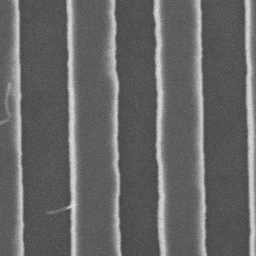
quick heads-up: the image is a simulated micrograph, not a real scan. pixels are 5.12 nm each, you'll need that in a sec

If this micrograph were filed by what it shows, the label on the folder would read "lines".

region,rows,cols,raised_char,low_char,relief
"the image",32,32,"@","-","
@@-------@@@@@------@@@@@------@
@@-------@@@@@------@@@@@------@
@@-------@@@@@------@@@@@------@
@@-------@@@@@------@@@@@------@
@@-------@@@@@------@@@@@------@
@@-------@@@@@------@@@@@------@
@@-------@@@@@------@@@@@------@
@@-------@@@@@------@@@@@------@
@@-------@@@@@------@@@@@------@
@@-------@@@@@@-----@@@@@------@
@@-------@@@@@@-----@@@@@------@
@@-------@@@@@@-----@@@@@------@
@@-------@@@@@@-----@@@@@------@
@@-------@@@@@@-----@@@@@------@
@@-------@@@@@@-----@@@@@------@
@@@------@@@@@@-----@@@@@------@
@@@------@@@@@@-----@@@@@------@
@@@------@@@@@@-----@@@@@------@
@@@------@@@@@@-----@@@@@------@
@@@------@@@@@@-----@@@@@------@
@@@------@@@@@@-----@@@@@------@
@@@------@@@@@@-----@@@@@------@
@@@------@@@@@@-----@@@@@------@
@@@------@@@@@@-----@@@@@@-----@
@@@------@@@@@@-----@@@@@@-----@
@@@------@@@@@@-----@@@@@@-----@
@@@------@@@@@@-----@@@@@@------
@@@------@@@@@@-----@@@@@@------
@@@------@@@@@@-----@@@@@@------
@@@------@@@@@@-----@@@@@@------
@@@------@@@@@@-----@@@@@@------
@@@------@@@@@@-----@@@@@@------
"